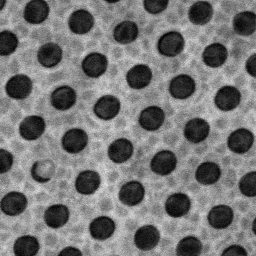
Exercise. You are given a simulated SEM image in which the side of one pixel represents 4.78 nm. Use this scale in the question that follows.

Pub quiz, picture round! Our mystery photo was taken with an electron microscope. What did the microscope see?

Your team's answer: a regular array of holes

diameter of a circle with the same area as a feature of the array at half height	126	nm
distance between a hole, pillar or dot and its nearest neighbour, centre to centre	211	nm